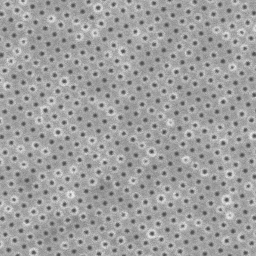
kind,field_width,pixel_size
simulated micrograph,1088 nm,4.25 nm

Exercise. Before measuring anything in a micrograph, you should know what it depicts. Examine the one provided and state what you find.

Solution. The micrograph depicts a regular array of holes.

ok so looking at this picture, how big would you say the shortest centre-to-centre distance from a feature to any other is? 46.8 nm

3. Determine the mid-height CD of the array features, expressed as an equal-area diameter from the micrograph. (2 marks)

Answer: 22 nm